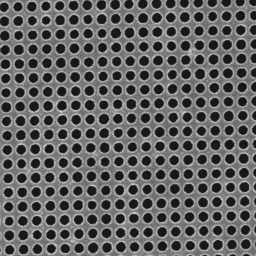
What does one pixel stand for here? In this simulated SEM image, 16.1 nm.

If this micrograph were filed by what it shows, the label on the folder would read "a regular array of holes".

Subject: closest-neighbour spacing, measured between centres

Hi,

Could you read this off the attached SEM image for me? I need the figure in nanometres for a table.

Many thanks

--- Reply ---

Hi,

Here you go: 222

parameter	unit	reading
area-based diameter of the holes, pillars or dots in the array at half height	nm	160